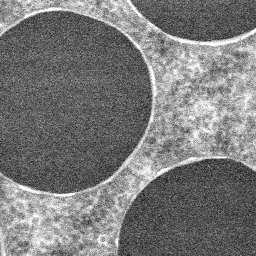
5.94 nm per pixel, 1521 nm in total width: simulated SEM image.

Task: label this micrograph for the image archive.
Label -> holes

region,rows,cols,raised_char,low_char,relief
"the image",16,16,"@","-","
@@@@@@@@--------
@------@@@------
--------@@@@--@@
---------@@@@@@@
---------@@@@@@@
----------@@@@@@
----------@@@@@@
---------@@@@@@@
---------@@@@@@@
--------@@@@@@@@
-------@@@@-----
@-----@@@-------
@@@@@@@@--------
@@@@@@@@--------
@@@@@@@---------
@@@@@@@---------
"